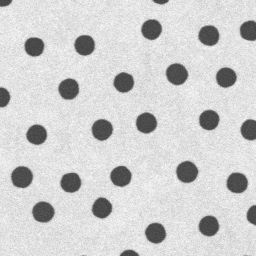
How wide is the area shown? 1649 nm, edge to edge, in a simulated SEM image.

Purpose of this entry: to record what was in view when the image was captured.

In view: a regular array of holes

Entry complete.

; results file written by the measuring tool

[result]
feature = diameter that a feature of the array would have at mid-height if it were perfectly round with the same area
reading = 20.9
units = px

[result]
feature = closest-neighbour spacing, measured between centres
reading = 295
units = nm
